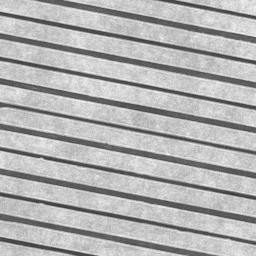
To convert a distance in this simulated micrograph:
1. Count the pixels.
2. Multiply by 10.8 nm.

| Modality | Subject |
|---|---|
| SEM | parallel lines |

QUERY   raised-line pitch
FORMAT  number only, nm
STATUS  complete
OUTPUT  239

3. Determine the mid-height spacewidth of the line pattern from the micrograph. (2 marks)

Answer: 56.9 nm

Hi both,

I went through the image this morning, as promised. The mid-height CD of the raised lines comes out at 0.179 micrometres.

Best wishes